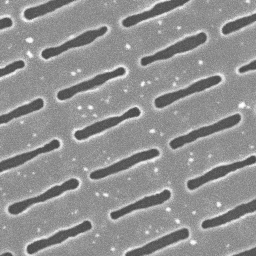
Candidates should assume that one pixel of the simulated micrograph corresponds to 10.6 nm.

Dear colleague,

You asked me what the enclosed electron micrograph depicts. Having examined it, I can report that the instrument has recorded a regular array of holes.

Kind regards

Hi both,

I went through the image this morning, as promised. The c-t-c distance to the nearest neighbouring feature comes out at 466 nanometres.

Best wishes